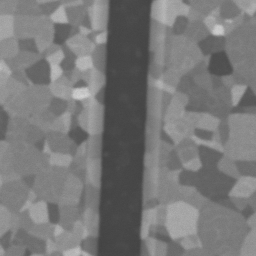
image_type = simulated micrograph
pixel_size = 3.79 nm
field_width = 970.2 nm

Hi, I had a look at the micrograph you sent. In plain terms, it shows one or a few lines or trenches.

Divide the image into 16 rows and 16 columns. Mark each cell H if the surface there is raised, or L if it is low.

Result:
HHHHHHLLLLHHHHHH
HHHHHHLLLLHHHHHH
HHHHHHLLLLHHHHHH
HHHHHHLLLLHHHHHH
HHHHHHLLLLHHHHHH
HHHHHHLLLLHHHHHH
HHHHHHLLLLHHHHHH
HHHHHHLLLLHHHHHH
HHHHHHLLLLHHHHHH
HHHHHHLLLHHHHHHH
HHHHHHLLLHHHHHHH
HHHHHHLLLHHHHHHH
HHHHHHLLLHHHHHHH
HHHHHHLLLHHHHHHH
HHHHHHLLLHHHHHHH
HHHHHHLLLHHHHHHH